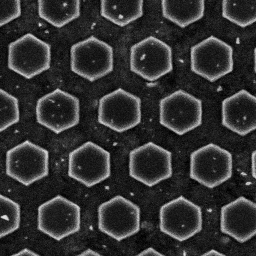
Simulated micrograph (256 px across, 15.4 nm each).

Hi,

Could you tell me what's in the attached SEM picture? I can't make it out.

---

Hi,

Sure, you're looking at a regular array of raised bodies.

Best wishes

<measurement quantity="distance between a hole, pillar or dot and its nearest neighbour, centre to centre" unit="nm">929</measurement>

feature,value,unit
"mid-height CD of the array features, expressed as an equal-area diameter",623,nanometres